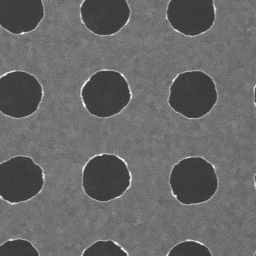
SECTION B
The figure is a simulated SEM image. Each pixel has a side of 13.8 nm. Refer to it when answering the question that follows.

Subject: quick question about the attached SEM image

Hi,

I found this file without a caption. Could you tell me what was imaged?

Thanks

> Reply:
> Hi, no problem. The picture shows holes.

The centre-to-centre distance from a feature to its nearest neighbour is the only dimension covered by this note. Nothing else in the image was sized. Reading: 1.18 µm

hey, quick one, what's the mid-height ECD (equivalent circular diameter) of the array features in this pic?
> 0.653 µm